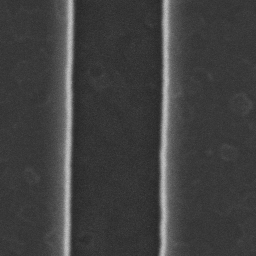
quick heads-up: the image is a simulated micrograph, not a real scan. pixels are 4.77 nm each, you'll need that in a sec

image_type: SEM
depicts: one or a few lines or trenches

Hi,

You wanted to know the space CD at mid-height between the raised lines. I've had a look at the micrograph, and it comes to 454 nm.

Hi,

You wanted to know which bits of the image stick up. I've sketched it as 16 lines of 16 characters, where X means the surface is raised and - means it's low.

XXXX------XXXXXX
XXXX------XXXXXX
XXXX------XXXXXX
XXXX------XXXXXX
XXXX------XXXXXX
XXXX------XXXXXX
XXXX------XXXXXX
XXXX------XXXXXX
XXXX------XXXXXX
XXXX------XXXXXX
XXXX------XXXXXX
XXXX------XXXXXX
XXXX------XXXXXX
XXXX------XXXXXX
XXXX------XXXXXX
XXXX------XXXXXX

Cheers